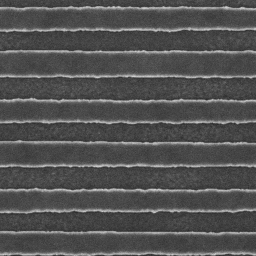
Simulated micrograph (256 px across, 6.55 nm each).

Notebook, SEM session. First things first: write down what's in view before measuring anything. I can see lines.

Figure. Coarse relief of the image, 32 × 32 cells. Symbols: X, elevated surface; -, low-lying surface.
--------------------------------
XXXXXXXXXXXXXXXXXXXXXXXXXXXXXXXX
XXXXXXXXXXXXXXXXXXXXXXXXXXXXXXXX
XXXXXXXXXXXXXXXXXXXXXXXXXXXXXXXX
--------------------------------
--------------------------------
XXXXXXXXXXXXXXXXXXXXXXXXXXXXXXXX
XXXXXXXXXXXXXXXXXXXXXXXXXXXXXXXX
XXXXXXXXXXXXXXXXXXXXXXXXXXXXXXXX
XXXXXXXXXXXXXXXXXXXXXXXXXXXXXXXX
--------------------------------
--------------------------------
XXXXX----X------------X---XX----
XXXXXXXXXXXXXXXXXXXXXXXXXXXXXXXX
XXXXXXXXXXXXXXXXXXXXXXXXXXXXXXXX
--------------------------------
--------------------------------
--------------------------------
XXXXXXXXXXXXXXXXXXXXXXXXXXXXXXXX
XXXXXXXXXXXXXXXXXXXXXXXXXXXXXXXX
XXXXXXXXXXXXXXXXXXXXXXXXXXXXXXXX
--------------------------------
--------------------------------
--------------------------------
XXXXXXXXXXXXXXXXXXXXXXXXXXXXXXXX
XXXXXXXXXXXXXXXXXXXXXXXXXXXXXXXX
XXXX---X------------------------
--------------------------------
--------------------------------
XXXXXXXXXXXXXXXXXXXXXXXXXXXXXXXX
XXXXXXXXXXXXXXXXXXXXXXXXXXXXXXXX
XXXXXXXXXXXXXXXXXXXXXXXXXXXXXXXX